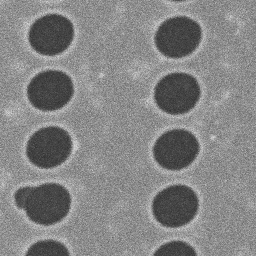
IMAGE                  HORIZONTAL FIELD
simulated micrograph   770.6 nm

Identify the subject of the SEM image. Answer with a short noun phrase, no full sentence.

a regular array of holes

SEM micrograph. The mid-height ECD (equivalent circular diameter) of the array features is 135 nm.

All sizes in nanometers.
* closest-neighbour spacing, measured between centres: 168